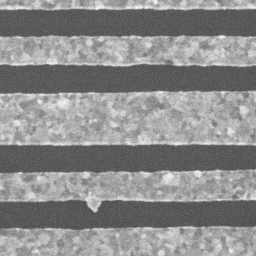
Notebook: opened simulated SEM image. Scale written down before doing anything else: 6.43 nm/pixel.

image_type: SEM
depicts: lines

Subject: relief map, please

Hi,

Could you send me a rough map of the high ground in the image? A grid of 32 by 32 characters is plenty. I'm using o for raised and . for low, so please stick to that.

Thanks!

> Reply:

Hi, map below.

oooooooooooooooooooooooooooooooo
................................
................................
................................
................................
oooooooooooooooooooooooooooooooo
oooooooooooooooooooooooooooooooo
oooooooooooooooooooooooooooooooo
................................
................................
................................
...................oo.o.o.oooooo
oooooooooooooooooooooooooooooooo
oooooooooooooooooooooooooooooooo
oooooooooooooooooooooooooooooooo
oooooooooooooooooooooooooooooooo
oooooooooooooooooooooooooooooooo
oooooooooooooooooooooooooooooooo
................................
................................
................................
....................o...oooooooo
oooooooooooooooooooooooooooooooo
oooooooooooooooooooooooooooooooo
oooooooooooooooooooooooooooooooo
...........o....................
................................
................................
......................oo..ooo...
oooooooooooooooooooooooooooooooo
oooooooooooooooooooooooooooooooo
oooooooooooooooooooooooooooooooo